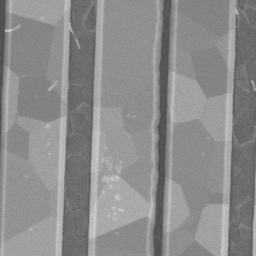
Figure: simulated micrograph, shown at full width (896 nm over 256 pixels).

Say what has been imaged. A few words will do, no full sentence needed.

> one or a few lines or trenches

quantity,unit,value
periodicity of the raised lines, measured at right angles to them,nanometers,286